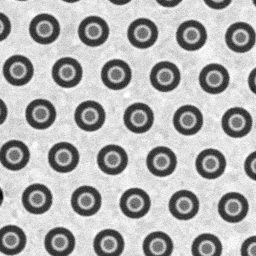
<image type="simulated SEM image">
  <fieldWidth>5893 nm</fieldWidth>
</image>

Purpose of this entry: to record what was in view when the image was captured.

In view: an array of small figures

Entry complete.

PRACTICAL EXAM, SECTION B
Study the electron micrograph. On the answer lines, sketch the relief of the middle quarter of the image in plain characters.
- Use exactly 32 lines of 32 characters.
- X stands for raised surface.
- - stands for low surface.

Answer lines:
-----XXXXX-------XXXXX-------XXX
XX---XXXX---XX---XXXX----X---XXX
XX---XXXX--XXXX--XXXX---XXX--XXX
XX---XXXX--XXXX--XXXX--XXXX--XXX
----XXXXX--------XXXX---XXX--XXX
---XXXXXXX------XXXXXX-------XXX
XXXXXXXXXXX----XXXXXXXX-----XXXX
XXXXXXXXXXXXXXXXXXXXXXXXXXXXXXXX
XXXXXXXXXXXXXXXXXXXXXXXXXXXXXXXX
XXXX-----XXXXXXXXX--XXXXXXXXXXXX
XXX-------XXXXXX-----XXXXXXXX---
XX----XX--XXXXX-------XXXXXX----
XX---XXX---XXXX--XXX---XXXX---XX
XX---XXX---XXXX--XXX---XXXX--XXX
XXX--XX---XXXXX--XXX---XXXX--XXX
XXX-------XXXXX-------XXXXX---XX
XXXX-----XXXXXXX------XXXXXX----
XXXXXXXXXXXXXXXXXX--XXXXXXXXX---
XXXXXXXXXXXXXXXXXXXXXXXXXXXXXXXX
--XXXXXXXXXXXXXXXXXXXXXXXXXXXXXX
---XXXXXXX-----XXXXXXXX--XXXXXXX
----XXXXX------XXXXXX------XXXXX
XX--XXXX---XX---XXXXX-------XXXX
XX--XXXX--XXXX--XXXX---XXX--XXXX
X---XXXX--XXXX--XXXX---XXX---XXX
----XXXX---XX---XXXX---XXX--XXXX
---XXXXXX------XXXXXX-------XXXX
-XXXXXXXXX----XXXXXXXX-----XXXXX
XXXXXXXXXXXXXXXXXXXXXXXX-XXXXXXX
XXXXXXXXXXXXXXXXXXXXXXXXXXXXXXXX
XXXX---XXXXXXXXXXXXXXXXXXXXXXXXX
XX-------XXXXXX-----XXXXXXXX----